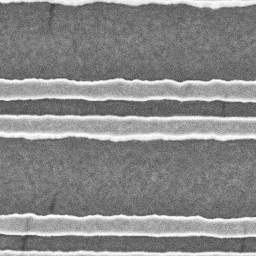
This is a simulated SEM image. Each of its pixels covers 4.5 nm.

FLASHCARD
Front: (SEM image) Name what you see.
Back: lines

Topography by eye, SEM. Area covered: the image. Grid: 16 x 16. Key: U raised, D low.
DDDDDDDDDDDDDDDD
DDDDDDDDDDDDDDDD
DDDDDDDDDDDDDDDD
DDDDDDDDDDDDDDDD
DDDDDDDDDDDDDDDD
UUUUUUUUUUUUUUUU
UUUUUUUUUUUUUUUU
UUUUUUUUUUUUUUUU
DUUUDUUUUUUUUUUU
DDDDDDDDDDDDDDDD
DDDDDDDDDDDDDDDD
DDDDDDDDDDDDDDDD
DDDDDDDDDDDDDDDD
UUUUDUUUDUUDDDDD
UUUUUUUUUUUUUUUU
UUUUUUUUUUUUUUUU